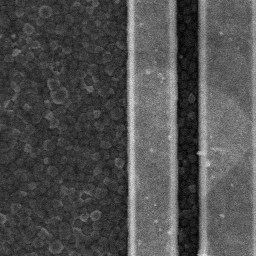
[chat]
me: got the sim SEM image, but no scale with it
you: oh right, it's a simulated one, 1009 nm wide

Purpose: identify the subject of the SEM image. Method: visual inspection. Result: one or a few lines or trenches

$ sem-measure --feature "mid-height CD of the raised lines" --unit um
0.163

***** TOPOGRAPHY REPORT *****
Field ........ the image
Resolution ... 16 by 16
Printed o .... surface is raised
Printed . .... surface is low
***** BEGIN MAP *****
........ooo..ooo
........ooo..ooo
........ooo..ooo
........ooo..ooo
........ooo..ooo
........ooo..ooo
........ooo..ooo
........ooo..ooo
........ooo..ooo
........ooo..ooo
........ooo..ooo
........ooo..ooo
........ooo..ooo
........ooo..ooo
........ooo..ooo
........ooo..ooo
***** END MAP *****